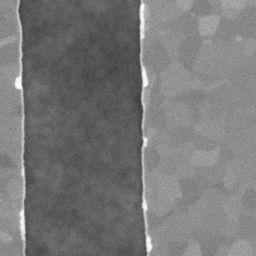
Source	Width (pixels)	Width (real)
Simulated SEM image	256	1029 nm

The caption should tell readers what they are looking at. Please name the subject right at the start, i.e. one or a few lines or trenches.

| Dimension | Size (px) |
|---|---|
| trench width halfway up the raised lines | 119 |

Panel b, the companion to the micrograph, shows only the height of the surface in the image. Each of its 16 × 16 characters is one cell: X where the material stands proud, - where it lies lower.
X--------XXXXXXX
X--------XXXXXXX
X--------XXXXXXX
X--------XXXXXXX
X--------XXXXXXX
X--------XXXXXXX
X--------XXXXXXX
X--------XXXXXXX
X--------XXXXXXX
X--------XXXXXXX
X--------XXXXXXX
XX-------XXXXXXX
XX-------XXXXXXX
X--------XXXXXXX
XX-------XXXXXXX
XX-------XXXXXXX